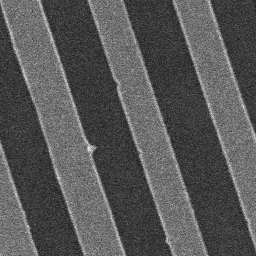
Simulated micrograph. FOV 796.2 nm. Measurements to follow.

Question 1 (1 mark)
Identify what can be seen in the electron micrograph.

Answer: one or a few lines or trenches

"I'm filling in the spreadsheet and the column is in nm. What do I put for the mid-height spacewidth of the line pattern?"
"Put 145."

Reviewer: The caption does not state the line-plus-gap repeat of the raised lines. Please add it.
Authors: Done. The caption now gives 253 nm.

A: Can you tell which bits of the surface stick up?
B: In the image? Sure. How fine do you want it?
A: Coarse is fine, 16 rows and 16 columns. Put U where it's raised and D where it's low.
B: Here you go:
UUUDDDUUDDDUUDDD
UUUDDDUUDDDUUUDD
DUUDDDUUDDDDUUDD
DUUUDDDUUDDDUUDD
DUUUDDDUUDDDUUDD
DDUUDDDUUDDDDUUD
DDUUUDDDUUDDDUUD
DDUUUDDDUUDDDUUU
DDDUUDDDUUDDDDUU
DDDUUUDDDUUDDDUU
UDDUUUDDDUUDDDUU
UDDDUUDDDUUDDDDU
UDDDUUUDDDUUDDDU
UUDDUUUDDDUUDDDU
UUDDDUUDDDUUDDDD
UUDDDUUUDDDUUDDD